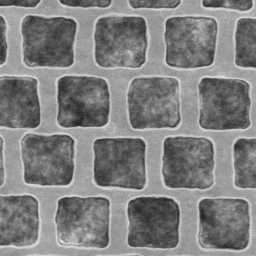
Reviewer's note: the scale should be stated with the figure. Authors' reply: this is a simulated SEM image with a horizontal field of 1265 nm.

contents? a regular array of holes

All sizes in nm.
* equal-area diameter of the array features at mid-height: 280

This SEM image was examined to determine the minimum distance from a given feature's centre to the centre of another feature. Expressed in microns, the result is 0.341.